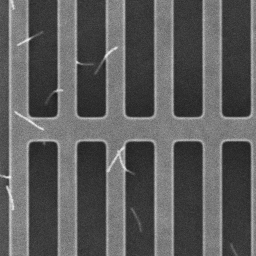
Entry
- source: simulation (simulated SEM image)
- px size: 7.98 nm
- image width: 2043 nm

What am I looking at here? groups of lines, slits or small figures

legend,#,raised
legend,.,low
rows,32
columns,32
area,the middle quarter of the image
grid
###........####........####.....
###........####........####.....
###........####........####.....
###........####........####.....
###........####........####.....
###........####........####.....
###........####........####.....
###........####........####.....
###........####........####.....
###........####........####.....
###........####........####.....
###........####........####.....
###.......#####........####.....
####.....########....########...
################################
################################
################################
################################
################################
####......######......######....
###.......#####........####.....
###........####........####.....
###........####........####.....
###........####........####.....
###........####........####.....
###........####........####.....
###........#####.......####.....
###........####........####.....
###........####........####.....
###........####........####.....
###........####........####.....
###........####........####.....